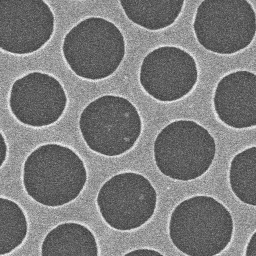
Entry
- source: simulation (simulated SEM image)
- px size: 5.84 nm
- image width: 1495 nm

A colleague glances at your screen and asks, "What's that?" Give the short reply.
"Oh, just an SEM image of holes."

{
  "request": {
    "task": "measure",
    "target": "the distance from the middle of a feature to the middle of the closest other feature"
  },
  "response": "76.2 pixels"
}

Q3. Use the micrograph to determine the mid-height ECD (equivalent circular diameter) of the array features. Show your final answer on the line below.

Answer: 0.357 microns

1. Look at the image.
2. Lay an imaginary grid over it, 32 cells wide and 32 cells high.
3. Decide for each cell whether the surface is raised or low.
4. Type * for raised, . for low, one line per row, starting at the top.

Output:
......*********........**......*
......**********.......**.......
.......***...***......**........
.......**......***...***........
......**.......*********........
......**........*********......*
*...****........***....****...**
********.......***......********
*********......***.......*******
***...****....***........***....
**......**********......***.....
*.......**********......***.....
*.......****....****..*****.....
*.......***......**********.....
**......**.......**********.....
***...****........***....***....
**********........**......******
.**********......**........*****
.****....**.....***........****.
.***......*********........**...
***.......*********.......***...
***........*********......***...
***........***....****..*****...
***.......***......**********...
****......**........****..****..
..***...****........**......***.
...**********......***.......***
...**********......**........***
...****....***...****........***
...***......*********........**.
...**.......**********.......**.
.****.......****....***.....***.